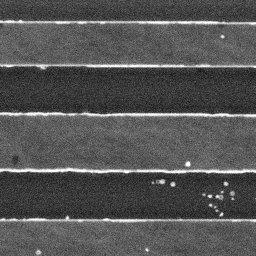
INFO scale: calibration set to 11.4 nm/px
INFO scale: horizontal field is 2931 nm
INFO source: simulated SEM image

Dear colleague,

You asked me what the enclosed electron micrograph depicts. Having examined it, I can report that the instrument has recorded lines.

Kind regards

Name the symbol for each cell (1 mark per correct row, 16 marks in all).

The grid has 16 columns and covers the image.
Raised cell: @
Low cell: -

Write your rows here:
----------------
@@@@@@@@@@@@@@@@
@@@@@@@@@@@@@@@@
@@@@@@@@@@@@@@@@
----------------
----------------
----------------
@@@@@@@@@@@@@@@@
@@@@@@@@@@@@@@@@
@@@@@@@@@@@@@@@@
@@@@@@@@@@@@@@@@
----------------
----------------
----------------
@@@@@@@@@@@@@@@@
@@@@@@@@@@@@@@@@